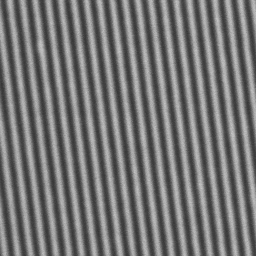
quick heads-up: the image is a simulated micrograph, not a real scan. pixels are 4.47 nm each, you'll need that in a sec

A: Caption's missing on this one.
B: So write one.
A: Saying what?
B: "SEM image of parallel lines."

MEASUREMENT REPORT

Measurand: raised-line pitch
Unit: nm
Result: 56.8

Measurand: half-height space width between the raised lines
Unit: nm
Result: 29.9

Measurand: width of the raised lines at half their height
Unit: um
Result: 0.0254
